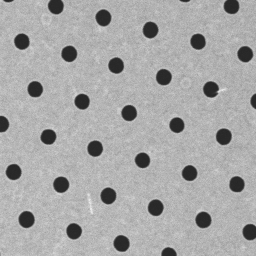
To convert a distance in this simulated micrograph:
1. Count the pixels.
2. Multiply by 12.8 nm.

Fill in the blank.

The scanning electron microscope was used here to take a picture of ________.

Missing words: a regular array of holes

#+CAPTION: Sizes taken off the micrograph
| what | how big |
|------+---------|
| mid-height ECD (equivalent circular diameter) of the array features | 204 nm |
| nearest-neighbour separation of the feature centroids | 619 nanometers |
